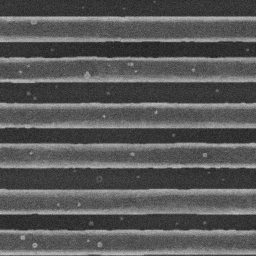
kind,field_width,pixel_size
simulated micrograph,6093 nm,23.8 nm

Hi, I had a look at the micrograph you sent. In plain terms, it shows lines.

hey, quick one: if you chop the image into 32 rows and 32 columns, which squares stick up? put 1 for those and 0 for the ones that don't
00000000000000000000000000000000
00000000000000000000000000000000
11111111111111111111111111111111
11111111111111111111111111111111
11111111111111111111111111111111
00000000000000000000000000000000
00000000000000000000000000000000
11111111111111111111111111111111
11111111111111111111111111111111
11111111111111111111111111111111
00000000000000000000000000000000
00000000000000000000000000000000
00000000000000000000000000000000
11111111111111111111111111111111
11111111111111111111111111111111
11111111111111111111111111111111
00000000000000000000000000000000
00000000000000000000000000000000
11111111111111111111111111111111
11111111111111111111111111111111
11111111111111111111111111111111
00000000000000000000000000000000
00000000000000000000000000000000
00000000000000000000000000000000
11111111111111111111111111111111
11111111111111111111111111111111
11111111111111100000000000000111
00000000000000000000000000000000
00000000000000000000000000000000
11111111111111111111111111111111
11111111111111111111111111111111
11111111111111111111111111111111